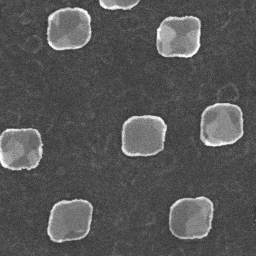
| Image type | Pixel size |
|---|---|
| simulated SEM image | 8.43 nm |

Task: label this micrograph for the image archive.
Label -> raised bodies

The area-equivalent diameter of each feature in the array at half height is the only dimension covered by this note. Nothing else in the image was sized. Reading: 0.376 um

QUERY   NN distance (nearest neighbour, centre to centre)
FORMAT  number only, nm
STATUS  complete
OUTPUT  810